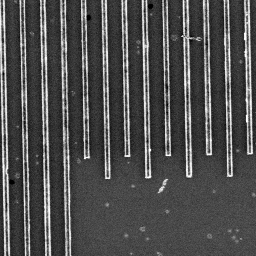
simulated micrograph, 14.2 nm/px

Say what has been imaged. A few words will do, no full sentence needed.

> parallel lines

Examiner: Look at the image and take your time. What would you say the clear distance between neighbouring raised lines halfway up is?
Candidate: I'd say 233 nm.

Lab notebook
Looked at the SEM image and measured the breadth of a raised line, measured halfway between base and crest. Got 60.4 nm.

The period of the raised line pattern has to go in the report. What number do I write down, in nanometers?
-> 290